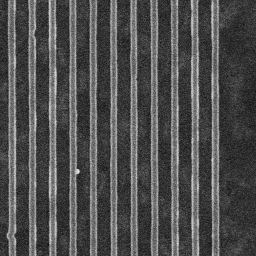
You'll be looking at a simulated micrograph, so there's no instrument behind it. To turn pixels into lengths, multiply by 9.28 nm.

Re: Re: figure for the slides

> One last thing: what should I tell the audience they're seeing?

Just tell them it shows parallel lines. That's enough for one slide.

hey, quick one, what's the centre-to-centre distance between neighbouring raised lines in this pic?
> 188 nm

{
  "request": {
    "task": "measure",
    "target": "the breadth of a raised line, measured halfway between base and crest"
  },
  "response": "0.0603 micrometres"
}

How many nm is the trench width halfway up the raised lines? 128